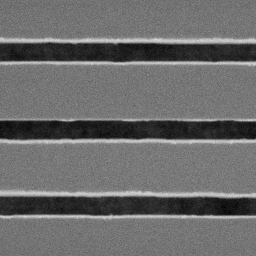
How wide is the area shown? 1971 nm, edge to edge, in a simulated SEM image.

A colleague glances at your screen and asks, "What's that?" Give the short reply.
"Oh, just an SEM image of lines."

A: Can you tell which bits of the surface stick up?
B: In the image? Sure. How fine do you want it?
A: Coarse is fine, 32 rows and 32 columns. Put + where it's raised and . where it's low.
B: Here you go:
++++++++++++++++++++++++++++++++
++++++++++++++++++++++++++++++++
++++++++++++++++++++++++++++++++
++++++++++++++++++++++++++++++++
++++++++++++++++++++++++++++++++
................................
................................
................................
++++++++++++++++++++++++++++++++
++++++++++++++++++++++++++++++++
++++++++++++++++++++++++++++++++
++++++++++++++++++++++++++++++++
++++++++++++++++++++++++++++++++
++++++++++++++++++++++++++++++++
++++++++++++++++++++++++++++++++
................................
................................
..................++............
++++++++++++++++++++++++++++++++
++++++++++++++++++++++++++++++++
++++++++++++++++++++++++++++++++
++++++++++++++++++++++++++++++++
++++++++++++++++++++++++++++++++
++++++++++++++++++++++++++++++++
...........................+++++
................................
................................
++++++++++++++++++++++++++++++++
++++++++++++++++++++++++++++++++
++++++++++++++++++++++++++++++++
++++++++++++++++++++++++++++++++
++++++++++++++++++++++++++++++++